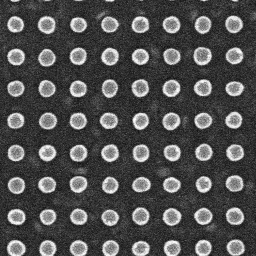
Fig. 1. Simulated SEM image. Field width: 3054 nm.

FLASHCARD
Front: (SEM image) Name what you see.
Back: a regular array of raised bodies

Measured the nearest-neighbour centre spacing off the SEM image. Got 370 nanometres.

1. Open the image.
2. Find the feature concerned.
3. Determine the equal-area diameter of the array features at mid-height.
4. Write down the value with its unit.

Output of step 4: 186 nm